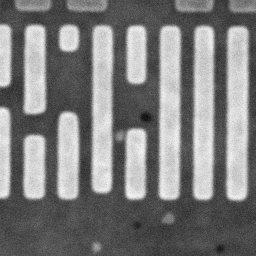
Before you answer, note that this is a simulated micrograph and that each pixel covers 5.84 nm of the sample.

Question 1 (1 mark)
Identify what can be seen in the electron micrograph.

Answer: wiring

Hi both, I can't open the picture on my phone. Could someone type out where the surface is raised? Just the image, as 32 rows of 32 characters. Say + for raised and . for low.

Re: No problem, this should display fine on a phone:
..++++...++++.........++++...+++
................................
................................
+...+...+...+...................
+..++...++..++..++..++...+...++.
+..++...++..++..++..++...+...++.
+..++.......++..++..++..++...++.
+..++.......++..++..++..+++..++.
+..++.......++..++..++..+++..++.
+..++.......++..++..++..++...++.
+..++.......++......++..++...++.
...++.......++......++..++...++.
...++.......++......++..++...++.
...++.......++......++..++...++.
+.......+...++......++..++...++.
+.......++..++......++..++...++.
+......+++..++..++..++..++...++.
+..++..+++..++..++..++..++...++.
+..++..+++..++..++..++..++...++.
+..++..+++..++..++..++..++...++.
+..++..+++..++..++..++..++...++.
+..++..+++..++..++..++..++...++.
+..++..+++..++..++..++..++...++.
+..++..+++..++..++..++..++...++.
+..++...+.......++..++...+...++.
................................
................................
................................
................................
................................
................................
................................